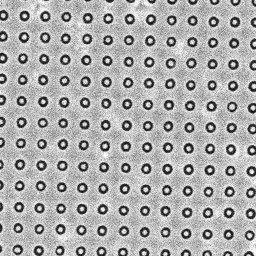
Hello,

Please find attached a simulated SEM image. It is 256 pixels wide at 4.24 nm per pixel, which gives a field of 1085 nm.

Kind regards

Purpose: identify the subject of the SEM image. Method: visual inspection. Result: a regular array of ring-shaped grooves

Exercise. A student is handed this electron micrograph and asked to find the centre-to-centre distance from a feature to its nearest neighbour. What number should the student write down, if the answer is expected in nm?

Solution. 87.7